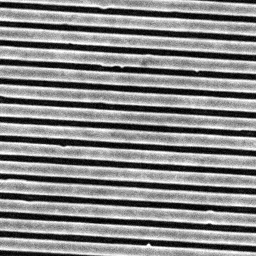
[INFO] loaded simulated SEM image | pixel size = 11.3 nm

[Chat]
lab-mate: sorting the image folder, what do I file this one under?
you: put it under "parallel lines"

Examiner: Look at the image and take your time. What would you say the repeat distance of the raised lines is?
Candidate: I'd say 216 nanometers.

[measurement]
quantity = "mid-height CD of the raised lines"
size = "134 nm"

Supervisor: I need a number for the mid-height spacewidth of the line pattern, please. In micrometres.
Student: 0.082